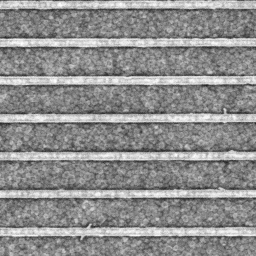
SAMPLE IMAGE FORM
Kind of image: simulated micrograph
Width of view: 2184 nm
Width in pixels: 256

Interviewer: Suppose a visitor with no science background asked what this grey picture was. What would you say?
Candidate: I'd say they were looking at parallel lines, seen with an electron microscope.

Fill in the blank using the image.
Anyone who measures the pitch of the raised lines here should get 323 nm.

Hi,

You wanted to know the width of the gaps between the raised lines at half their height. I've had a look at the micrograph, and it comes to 263 nanometers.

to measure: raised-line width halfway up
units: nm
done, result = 60.8